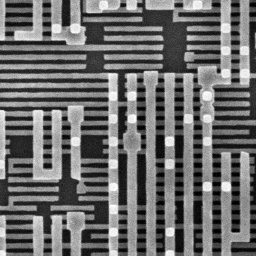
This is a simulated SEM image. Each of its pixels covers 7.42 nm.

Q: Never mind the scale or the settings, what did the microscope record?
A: wiring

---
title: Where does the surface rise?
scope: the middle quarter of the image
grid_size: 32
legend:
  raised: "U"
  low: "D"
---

DDDDDDDDDDDDDDDDDDDDDDDDDDDDDDDD
DDDDDDDDDDDDDDDDDDDDDDDDDDDDDDDD
DDDDDDDDDDDUUDDDDUDDUUUDDUUUDDUU
DDDDDDDDDDDUUDDDUUDDUUUDDUUUDDUU
DDDDDDDDDDDUUDDDUUDDUUUDDUUUDDUU
DDDDDDDDDDDUUDDDUUDDUUUDDUUUDDUU
DDDDDDDDDDDUUDDDUUDDDUUDDUUUDDUU
DDDDDDDDDDDUUDDDUUDDDUUDDUUDDDUU
DDDDDDDDDDDUUDDDUUDDDUUDDUUDDDUU
DDDDDDDDDDDUUDDDUUDDDUUDDUUDDDUU
DDDDDDDDDDDUUDDDUUDDDUUDDUUDDDUU
DUUUUDDDDDDUUDDDUUDDDUUDDUUDDDUU
DUUUUDDDDDDUUDDDUUDDDUUDDUUUDDUU
DUUUUDDDDDDUUDDDUUDDDUUDDUUUDDUU
DDUUDDDDDDDUUDDDUUDDDUUDDUUUDDUU
DDUUDDDDDDDUUDDDUUDDDUUDDUUUDDUU
DDUUDDDDDDDUUDDDUUDDDUUDDUUUDDUU
DDUUDDDDDDDUUDDUUUUDDUUDDUUUDDUU
DDUUDDDDDDDUUDDUUUUDDUUDDUUUDDUU
DDUUDDDDDDDUUDDUUUUDDUUDDUUUDDUU
DDUUDDDDDDDUUDDUUUUDDUUDDUUUDDUU
DDUUDDDDDDDUUDDUUUUDDUUDDUUUDDUU
DDUUDDDDDDDUUDDDUUDDDUUDDUUUDDUU
DDUUDDDDDDDUUDDDUUDDDUUDDUUUDDUU
DDUUDDDDDDDUUDDDUUDDDUUDDUUUDDUU
DDUUDDDDDDDUUDDDUUDDDUUDDUUUDDUU
DDUUDDDDDDDUUDDDUUDDDUUDDUUUDDUU
DDUUDDDDDDDUUDDDUUDDDUUDDUUUDDUU
DDUUDDDDDDDUUDDDUUDDDUUDDUUUDDUU
DDDDDDDDDDDUUDDDUUDDDUUDDUUUDDUU
DDDDDDDDDDDUUDDDUUDDDUUDDUUUDDUU
DDDDDDDDDDDUUDDDUUDDDUUDDUUUDDUU